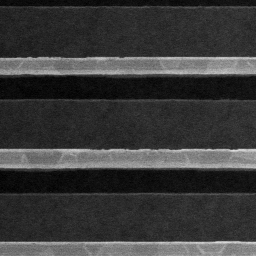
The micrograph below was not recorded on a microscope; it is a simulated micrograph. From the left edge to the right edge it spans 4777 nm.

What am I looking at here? lines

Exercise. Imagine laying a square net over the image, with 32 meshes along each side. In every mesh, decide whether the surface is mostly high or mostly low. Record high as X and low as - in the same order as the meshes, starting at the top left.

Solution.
--------------------------------
XXXXXXXXXXXXXXXXXXXXXXXXXXXXXXXX
XXXXXXXXXXXXXXXXXXXXXXXXXXXXXXXX
XXXXXXXXXXXXXXXXXXXXXXXXXXXXXXXX
XXXXXXXXXXXXXXXXXXXXXXXXXXXXXXXX
XXXXXXXXXXXXXXXXXXXXXXXXXXXXXXXX
XXXXXXXXXXXXXXXXXXXXXXXXXXXXXXXX
XXXXXXXXXXXXXXXXXXXXXXXXXXXXXXXX
XXXXXXXXXXXXXXXXXXXXXXXXXXXXXXXX
--------------------------------
--------------------------------
--------------------------------
--XXXXXXX---XX------XXX---------
XXXXXXXXXXXXXXXXXXXXXXXXXXXXXXXX
XXXXXXXXXXXXXXXXXXXXXXXXXXXXXXXX
XXXXXXXXXXXXXXXXXXXXXXXXXXXXXXXX
XXXXXXXXXXXXXXXXXXXXXXXXXXXXXXXX
XXXXXXXXXXXXXXXXXXXXXXXXXXXXXXXX
XXXXXXXXXXXXXXXXXXXXXXXXXXXXXXXX
XXXXXXXXXXXXXXXXXXXXXXXXXXXXXXXX
XXXXXXXXXXXXXXXXXXXXXXXXXXXXXXXX
--------------------------------
--------------------------------
--------------------------------
XXXXXXXXXXXXXXXXXXXXXXXXXXXXXXXX
XXXXXXXXXXXXXXXXXXXXXXXXXXXXXXXX
XXXXXXXXXXXXXXXXXXXXXXXXXXXXXXXX
XXXXXXXXXXXXXXXXXXXXXXXXXXXXXXXX
XXXXXXXXXXXXXXXXXXXXXXXXXXXXXXXX
XXXXXXXXXXXXXXXXXXXXXXXXXXXXXXXX
XXXXXXXXXXXXXXXXXXXXXXXXXXXXXXXX
XXXXXXXXXXXXXXXXXXXXXXXXXXXXXXXX